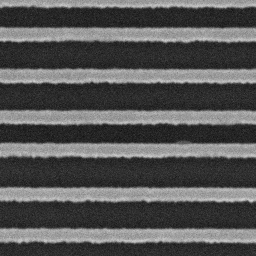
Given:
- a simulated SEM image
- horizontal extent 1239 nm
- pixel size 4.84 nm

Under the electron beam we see lines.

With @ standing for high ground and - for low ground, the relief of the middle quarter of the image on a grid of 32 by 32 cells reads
--------------------------------
@--@---@------------------------
@@@@@@@@@@@@@@@@@@@@@@@@@@@@@@@@
@@@@@@@@@@@@@@@@@@@@@@@@@@@@@@@@
@@@@@@@@@--@@@@@@@@@@@@-@@@@@@@@
--------------------------------
--------------------------------
--------------------------------
--------------------------------
--------------------------------
--------------------------------
--------------------------------
@@@@@@@@@@@@@@@@@@@@@@@@@@@@@@@@
@@@@@@@@@@@@@@@@@@@@@@@@@@@@@@@@
@@@@@@@@@@@@@@@@@@@@@@@@@@@@@@@@
--------------------------------
--------------------------------
--------------------------------
--------------------------------
--------------------------------
@@@@@@@@@@@@@@@@@@@@@@@@@@@@@@@@
@@@@@@@@@@@@@@@@@@@@@@@@@@@@@@@@
@@@@@@@@@@@@@@@@@@@@@@@@@@@@@@@@
--------------------------------
--------------------------------
--------------------------------
--------------------------------
--------------------------------
--------------------------------
--------------------------------
--------------------------------
@@@@@@@@@@@@@@@@@@@@@@@@@@@@@@@@